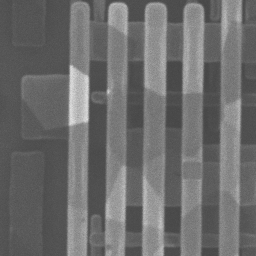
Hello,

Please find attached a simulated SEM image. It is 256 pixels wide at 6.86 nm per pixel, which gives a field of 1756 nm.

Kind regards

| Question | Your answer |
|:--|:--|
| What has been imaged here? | wiring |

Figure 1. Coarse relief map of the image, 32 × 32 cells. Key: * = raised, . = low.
.........**...**...*....*...**..
.........**...**..***..**...**..
.........**..***..***..***..**..
.........**********************.
.........********.*************.
.........*******..**************
.........*******..**************
.........*******..**************
.........**..***..***..**...**..
.........**..***..***..**...**..
.........**..***..***..**...**..
.........**..***..***.****.***..
.........**..*******************
.........**..***..***..**..***..
.........**..***..***..**...**..
.........**..***..***..**...**..
.........**..************...**..
.........**..************...**..
.........**..************...**..
.........**..************...**..
.........**..*******************
.........**..*******************
.........**..*******************
.........**..*******************
.........**..*******************
.........**..*******************
.........**..***..**...**..***..
.........**..***..**...**..***..
.........**..***..**...**..***..
.........************.**********
........*************.**********
........***..***..**...**..***..